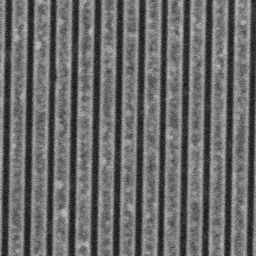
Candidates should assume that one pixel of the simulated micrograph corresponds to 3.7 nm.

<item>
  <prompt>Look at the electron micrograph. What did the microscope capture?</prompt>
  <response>parallel lines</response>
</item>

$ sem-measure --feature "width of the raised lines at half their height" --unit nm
56.5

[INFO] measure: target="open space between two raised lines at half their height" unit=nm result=28.2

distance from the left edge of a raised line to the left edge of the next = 82.5 nm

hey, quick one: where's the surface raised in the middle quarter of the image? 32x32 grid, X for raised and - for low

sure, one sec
XX--XXX--XXXX--XXX--XXXX--XXX---
XX--XXX--XXXX--XXX--XXXX--XXX---
XX--XXX--XXXX--XXX--XXXX--XXX---
XX--XXX--XXXX--XXX--XXXX--XXX---
XX-XXXX--XXXX--XXX--XXXX--XXX---
XX-XXXX--XXXX--XXX--XXXX--XXX---
XX-XXXX--XXXX--XXX--XXXX--XXX---
XX-XXXX--XXXX--XXX--XXXX--XXX--X
XX-XXXX--XXXX--XXX--XXXX--XXX--X
X--XXXX--XXXX--XXX--XXXX--XXX--X
X--XXXX--XXXX--XXX--XXXX--XXX--X
X--XXXX--XXXX--XXX--XXXX--XXX--X
X--XXXX--XXXX--XXX--XXXX--XXX--X
X--XXXX--XXXX--XXX--XXXX--XXX--X
X--XXXX--XXXX--XXX--XXXX--XXX--X
X--XXXX--XXX---XXX--XXXX--XXX--X
X--XXXX--XXX---XXX--XXXX--XXX--X
X--XXXX--XXX---XXX--XXXX--XXX--X
X--XXXX--XXX---XXX--XXXX--XXX--X
X--XXXX--XXX---XXX--XXXX--XXX--X
X--XXXX--XXX--XXXX--XXXX--XXX--X
X--XXXX--XXX--XXXX--XXXX--XXX--X
X--XXXX--XXX--XXXX--XXXX-XXXX--X
X--XXXX--XXX--XXXX--XXXX-XXXX--X
X--XXXX--XXX--XXXX--XXXX-XXXX--X
X--XXXX--XXX--XXXX--XXXX-XXXX--X
X--XXXX--XXX--XXXX--XXXX-XXXX--X
X--XXXX--XXX--XXXX--XXX--XXXX--X
X--XXXX--XXX--XXXX--XXX--XXXX--X
X--XXXX--XXX--XXXX--XXX--XXXX--X
X--XXXX--XXX--XXXX--XXX--XXXX--X
X--XXXX--XXX--XXXX--XXX--XXXX--X